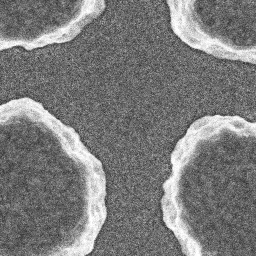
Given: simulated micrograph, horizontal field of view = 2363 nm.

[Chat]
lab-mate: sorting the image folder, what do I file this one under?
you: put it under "raised bodies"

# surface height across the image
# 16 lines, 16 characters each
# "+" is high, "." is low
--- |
+++++......+++++
+++++......+++++
+++..........+++
................
................
................
................
+++...........+.
+++++.......++++
+++++.......++++
++++++.....+++++
++++++.....+++++
++++++.....+++++
++++++.....+++++
++++++.....+++++
+++++.......++++